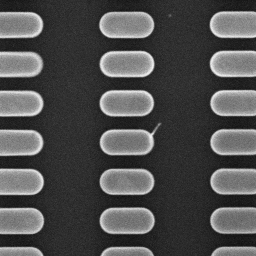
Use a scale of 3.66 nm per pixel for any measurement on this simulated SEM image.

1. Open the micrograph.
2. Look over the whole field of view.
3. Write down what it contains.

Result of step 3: groups of lines, slits or small figures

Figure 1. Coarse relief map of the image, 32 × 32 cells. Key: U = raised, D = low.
DDDDDDDDDDDDDDDDDDDDDDDDDDDDDDDD
DDDDDDDDDDDDDDDDDDDDDDDDDDDDDDDD
UUUUUDDDDDDDDUUUUUUDDDDDDDDUUUUU
UUUUUDDDDDDDDUUUUUUDDDDDDDUUUUUU
UUUUDDDDDDDDDUUUUUDDDDDDDDDUUUUU
DDDDDDDDDDDDDDDDDDDDDDDDDDDDDDDD
DDDDDDDDDDDDDDDDDDDDDDDDDDDDDDDD
UUUUUDDDDDDDDUUUUUUDDDDDDDUUUUUU
UUUUUDDDDDDDDUUUUUUDDDDDDDDUUUUU
DDDDDDDDDDDDDDDDDDDDDDDDDDDDDDDD
DDDDDDDDDDDDDDDDDDDDDDDDDDDDDDDD
UDDDDDDDDDDDDDUUUUDDDDDDDDDUUUUU
UUUUUDDDDDDDDUUUUUUDDDDDDDDUUUUU
UUUUUDDDDDDDDUUUUUUDDDDDDDDUUUUU
DDDDDDDDDDDDDDDDDDDDDDDDDDDDDDDD
DDDDDDDDDDDDDDDDDDDDDDDDDDDDDDDD
UUUUDDDDDDDDDUUUUUDDDDDDDDDUUUUU
UUUUUDDDDDDDDUUUUUUDDDDDDDUUUUUU
UUUUUDDDDDDDDUUUUUUDDDDDDDDUUUUU
DDDDDDDDDDDDDDDDDDDDDDDDDDDDDDDD
DDDDDDDDDDDDDDDDDDDDDDDDDDDDDDDD
UUUUUDDDDDDDDUUUUUDDDDDDDDDUUUUU
UUUUUDDDDDDDDUUUUUUDDDDDDDUUUUUU
UUUUUDDDDDDDDUUUUUUDDDDDDDDUUUUU
DDDDDDDDDDDDDDDDDDDDDDDDDDDDDDDD
DDDDDDDDDDDDDDDDDDDDDDDDDDDDDDDD
UUUUUDDDDDDDDUUUUUUDDDDDDDDUUUUU
UUUUUDDDDDDDDUUUUUUDDDDDDDUUUUUU
UUUUUDDDDDDDDUUUUUUDDDDDDDDUUUUU
DDDDDDDDDDDDDDDDDDDDDDDDDDDDDDDD
DDDDDDDDDDDDDDDDDDDDDDDDDDDDDDDD
UUUUUDDDDDDDDUUUUUUDDDDDDDDUUUUU